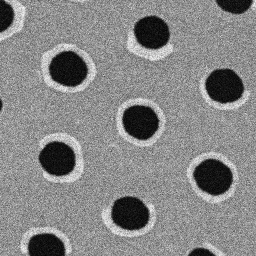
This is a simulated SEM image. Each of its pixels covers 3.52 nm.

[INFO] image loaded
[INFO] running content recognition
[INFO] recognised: holes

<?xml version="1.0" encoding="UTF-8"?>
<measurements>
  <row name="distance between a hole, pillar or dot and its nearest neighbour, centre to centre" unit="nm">317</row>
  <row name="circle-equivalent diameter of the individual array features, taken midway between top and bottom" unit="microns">0.126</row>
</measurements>